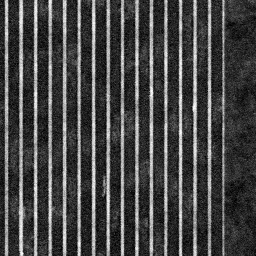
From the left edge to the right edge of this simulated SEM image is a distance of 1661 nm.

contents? parallel lines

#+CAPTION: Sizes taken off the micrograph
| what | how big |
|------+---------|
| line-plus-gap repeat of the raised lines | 94.1 nanometers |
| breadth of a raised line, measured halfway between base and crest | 2.5 pixels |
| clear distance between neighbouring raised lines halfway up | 77 nanometres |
